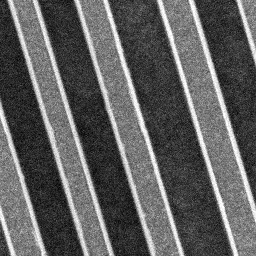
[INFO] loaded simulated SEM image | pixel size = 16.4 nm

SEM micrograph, one or a few lines or trenches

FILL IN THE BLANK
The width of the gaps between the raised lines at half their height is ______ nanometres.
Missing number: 662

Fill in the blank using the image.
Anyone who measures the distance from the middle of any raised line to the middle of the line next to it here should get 1.18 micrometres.